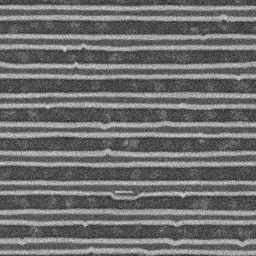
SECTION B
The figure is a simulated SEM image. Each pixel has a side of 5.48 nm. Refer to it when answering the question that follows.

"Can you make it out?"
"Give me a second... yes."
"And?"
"parallel lines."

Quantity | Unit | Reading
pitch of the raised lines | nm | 160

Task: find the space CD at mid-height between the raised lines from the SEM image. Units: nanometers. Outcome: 102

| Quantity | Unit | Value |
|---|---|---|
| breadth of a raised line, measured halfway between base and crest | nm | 56.9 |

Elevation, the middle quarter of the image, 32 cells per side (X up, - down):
--XX----------------------------
XXXXXXXXXXXXXXXXXXXXXXXXXXXXXXXX
XXXXXXXXXXXXXXXXXXXXXXXXXXXXXXXX
--------------------------------
--------------------------------
--------------------------------
--------------------------------
--------------------------------
XXXXXXXXXXXXXXXXXXXXXXXXXXXXXXXX
XXXXXXXXXXXXXXXXXXXXXXXXXXXXXXXX
------------------------------XX
--------------------------------
--------------------------------
--------------------------------
--------------------------------
---XXXXXX--XXXXXXX--XXXXXXXXXXXX
XXXXXXXXXXXXXXXXXXXXXXXXXXXXXXXX
-XXXXXXXXXXXXXXXXXXXX-XXXXXXXXXX
--------------------------------
--------------------------------
--------------------------------
--------------------------------
----------XX--------------------
XXXXXXXXXXXXXXXXXXXXXXXXXXXXXXXX
XXXXXXXXXXXXXXXXXXXXXXXXXXXXXXXX
--------------------------------
--------------------------------
--------------------------------
--------------------------------
--------------------------------
XXXXXXXXXXXXXXXXXXXXXXXXXXXXXXXX
XXXXXXXXXXXXXXXXXXXXXXXXXXXXXXXX